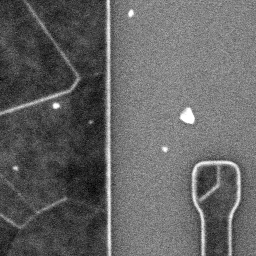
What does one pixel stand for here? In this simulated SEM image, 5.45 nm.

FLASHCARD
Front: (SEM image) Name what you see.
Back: wiring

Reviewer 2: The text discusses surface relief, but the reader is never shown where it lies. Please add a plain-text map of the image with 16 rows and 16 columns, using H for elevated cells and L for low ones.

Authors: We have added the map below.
HHHHHHHLLLLLLLLL
HHHHHHHLLLLLLLLL
HHHHHHHLLLLLLLLL
HHHHHHHLLLLLLLLL
HHHHHHHLLLLLLLLL
HHHHHHHLLLLLLLLL
HHHHHHHLLLLLLLLL
HHHHHHHLLLLLLLLL
HHHHHHHLLLLLLLLL
HHHHHHHLLLLLLLLL
HHHHHHHLLLLLHHHL
HHHHHHHLLLLLHHHL
HHHHHHHLLLLLHHHL
HHHHHHHLLLLLLHHL
HHHHHHHLLLLLLHLL
HHHHHHHLLLLLLHLL